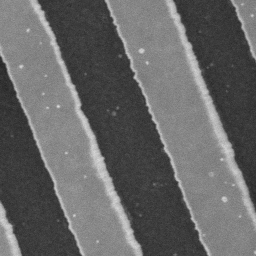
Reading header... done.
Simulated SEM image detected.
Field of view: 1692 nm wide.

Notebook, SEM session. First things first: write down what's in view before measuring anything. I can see lines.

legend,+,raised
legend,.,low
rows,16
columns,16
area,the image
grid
+++....++++....+
+++....++++....+
+++.....++++...+
++++....++++....
++++....+++++...
.++++....++++...
.++++....++++...
..+++.....++++..
..++++....++++..
..++++....+++++.
...++++....++++.
...++++....++++.
....+++.....++++
....++++....++++
+...++++....++++
+....++++....+++